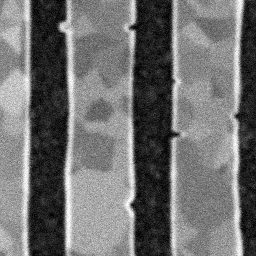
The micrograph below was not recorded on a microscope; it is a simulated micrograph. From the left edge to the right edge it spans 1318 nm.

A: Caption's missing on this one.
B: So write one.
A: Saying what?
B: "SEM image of one or a few lines or trenches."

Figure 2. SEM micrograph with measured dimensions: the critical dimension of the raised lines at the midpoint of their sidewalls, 323 nm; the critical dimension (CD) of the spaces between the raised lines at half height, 215 nanometres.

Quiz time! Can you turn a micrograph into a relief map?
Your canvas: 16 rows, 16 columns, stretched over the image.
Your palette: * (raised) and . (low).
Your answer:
**..****...****.
**..****...****.
**..****...****.
**..****...****.
**..****...****.
**..****...****.
**..****...****.
**..****...****.
**..****...****.
**..****...****.
**..****...****.
**..****...****.
**..****...****.
**..****...****.
**..****...****.
**..****...****.